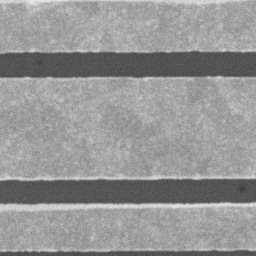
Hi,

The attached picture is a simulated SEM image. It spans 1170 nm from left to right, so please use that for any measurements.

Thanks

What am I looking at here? lines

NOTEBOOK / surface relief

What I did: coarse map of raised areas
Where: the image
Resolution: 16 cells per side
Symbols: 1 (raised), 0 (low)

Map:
1111111111111111
1111111111111111
1111111111111111
0000000000000000
0000000000000000
1111111111111111
1111111111111111
1111111111111111
1111111111111111
1111111111111111
1111111111111111
0000000000000000
0000000000000000
1111111111111111
1111111111111111
1111111111111111